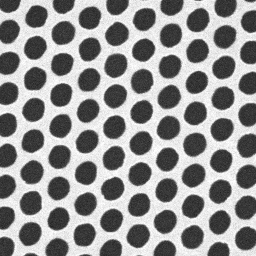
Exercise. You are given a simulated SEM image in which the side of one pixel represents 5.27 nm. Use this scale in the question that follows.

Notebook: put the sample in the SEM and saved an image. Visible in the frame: a regular array of holes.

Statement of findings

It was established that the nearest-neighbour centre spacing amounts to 162 nanometres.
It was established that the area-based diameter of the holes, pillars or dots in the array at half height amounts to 22.9 px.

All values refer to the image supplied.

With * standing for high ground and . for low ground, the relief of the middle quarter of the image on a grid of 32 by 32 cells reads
..********......********.....***
..***...**.....****..***.....***
.***.....**....**.....**....****
****.....***.****.....***..****.
***......********.....********..
..**....****...**.....****..**..
..**...****.....*.....**.....**.
..********......********.....***
..********.....********......***
.****...**.....***...**......***
****.....**...***.....**....***.
***......********.....********..
***......********.....********..
.**.....***....**.....***...**..
..***.****.....***...***.....**.
..********.....********......***
..********.....********......***
.***....**.....***...**.....****
***......**..****.....**...***..
***.....********......********..
***.....****.***......********..
.***...****....**....***....**..
..***.****.....***..****....***.
.*********.....********......***
.****..***.....********.....****
****....**....***....**.....***.
***.....***..***......**...***..
***.....********......********..
***.....****..**......*******...
.***...***.....**....***....**..
.********......***.****.....***.
.********......********.....****